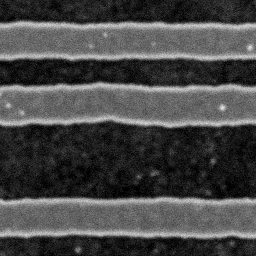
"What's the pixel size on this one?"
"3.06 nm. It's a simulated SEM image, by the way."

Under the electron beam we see lines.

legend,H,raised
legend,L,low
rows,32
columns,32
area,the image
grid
LLLLLLLLLLLLLLLLLLLLLLLLLLLLLLLL
LLLLLLLLLLLLLLLLLLLLLLLLLLLLLLLL
LLLLLLLLLLLLLLLLLLLLLLLLLLLLLLLL
HHHHHHHHHHHHHHHHHHHHHHHHHHHHHHHH
HHHHHHHHHHHHHHHHHHHHHHHHHHHHHHHH
HHHHHHHHHHHHHHHHHHHHHHHHHHHHHHHH
HHHHHHHHHHHHHHHHHHHHHHHHHHHHHHHH
LLLLLLLLLLLLLLLLLLLLLLLLLLHLLLLL
LLLLLLLLLLLLLLLLLLLLLLLLLLLLLLLL
LLLLLLLLLLLLLLLLLLLLLLLLLLLLLLLL
LLLLLLLLLLLLHHLLLLLLLLLLLLLLLLLL
HHHHHHHHHHHHHHHHHHHHHHHHHHHHHHHH
HHHHHHHHHHHHHHHHHHHHHHHHHHHHHHHH
HHHHHHHHHHHHHHHHHHHHHHHHHHHHHHHH
HHHHHHHHHHHHHHHHHHHHHHHHHHHHHHHH
HHHLLLLLHLLLLLLLLHHHHHHHHHHHHHLL
LLLLLLLLLLLLLLLLLLLLLLLLLLLLLLLL
LLLLLLLLLLLLLLLLLLLLLLLLLLLLLLLL
LLLLLLLLLLLLLLLLLLLLLLLLLLLLLLLL
LLLLLLLLLLLLLLLLLLLLLLLLLLLLLLLL
LLLLLLLLLLLLLLLLLLLLLLLLLLLLLLLL
LLLLLLLLLLLLLLLLLLLLLLLLLLLLLLLL
LLLLLLLLLLLLLLLLLLLLLLLLLLLLLLLL
LLLLLLLLLLLLLLLLLLLLLLLLLLLLLLLL
LLLLLLLLLLLLLLLLLLLLLLLLLLLLLLLL
HHHHHHHHHHHHHHHHHHHHHHHHHHHHHHHH
HHHHHHHHHHHHHHHHHHHHHHHHHHHHHHHH
HHHHHHHHHHHHHHHHHHHHHHHHHHHHHHHH
HHHHHHHHHHHHHHHHHHHHHHHHHHHHHHHH
HHHHLLHHLLLLHLLLHHHHHHHHHHHHHHHH
LLLLLLLLLLLLLLLLLLLLLLLLLLLLLLLL
LLLLLLLLLLLLLLLLLLLLLLLLLLLLLLLL